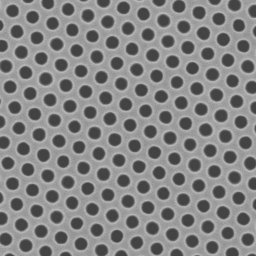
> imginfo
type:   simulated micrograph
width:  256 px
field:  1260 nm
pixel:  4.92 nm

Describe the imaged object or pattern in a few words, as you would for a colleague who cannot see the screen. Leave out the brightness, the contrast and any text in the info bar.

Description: a regular array of holes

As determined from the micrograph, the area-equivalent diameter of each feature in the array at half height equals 60.3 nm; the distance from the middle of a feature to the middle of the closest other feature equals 102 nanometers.